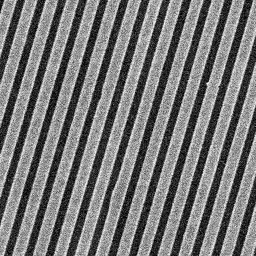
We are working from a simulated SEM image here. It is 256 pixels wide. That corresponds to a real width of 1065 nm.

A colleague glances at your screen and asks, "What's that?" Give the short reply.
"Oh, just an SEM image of parallel lines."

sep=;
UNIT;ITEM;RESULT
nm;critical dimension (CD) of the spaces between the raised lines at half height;35.4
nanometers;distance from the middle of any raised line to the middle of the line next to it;82.8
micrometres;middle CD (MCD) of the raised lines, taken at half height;0.0469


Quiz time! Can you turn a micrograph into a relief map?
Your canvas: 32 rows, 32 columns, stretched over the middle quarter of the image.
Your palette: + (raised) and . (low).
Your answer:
.+++..+++..+++...++...+++..+++..
.+++..+++..+++...++...++...+++..
+++...+++..+++..+++..+++...++...
+++..+++..+++...+++..+++..+++..+
+++..+++..+++...++...++...+++..+
++...+++..+++..+++..+++...++...+
++..+++...+++..+++..+++..+++...+
++..+++..+++...++...+++..+++..++
++..+++..+++..+++...++...++...++
+...++...+++..+++..+++..+++...++
+..+++..+++...+++..+++..+++..+++
+..+++..+++...++...++...+++..+++
...+++..+++..+++..+++...++...+++
..+++...++...+++..+++..+++..+++.
..+++..+++...++...+++..+++..+++.
..+++..+++..+++...++...++...+++.
..++...+++..+++..+++..+++...+++.
.+++..+++...++...+++..+++..+++..
.+++..+++...++...+++..+++..+++..
.+++..+++..+++..+++...++...+++..
+++...++...+++..+++..+++..+++...
+++..+++...++...+++..+++..+++..+
+++..+++..+++...++...++...+++..+
++...+++..+++..+++..+++...++...+
++..+++...++...+++..+++..+++..++
++..+++..+++...+++..++...+++..++
++..+++..+++..+++..+++...+++..++
+..+++...+++..+++..+++..+++...++
+..+++...++...+++..+++..+++..+++
+..+++..+++..+++...+++..+++..+++
...++...+++..+++..+++..+++...+++
..+++...+++.++++..+++..+++..+++.